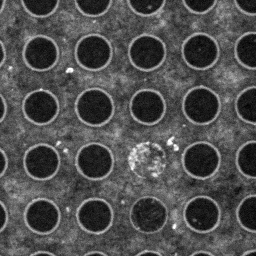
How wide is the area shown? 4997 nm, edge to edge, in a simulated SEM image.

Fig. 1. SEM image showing a regular array of raised bodies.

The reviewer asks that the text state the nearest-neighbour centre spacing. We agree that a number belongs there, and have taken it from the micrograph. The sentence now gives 1030 nm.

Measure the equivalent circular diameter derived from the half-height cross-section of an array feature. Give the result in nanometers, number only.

697